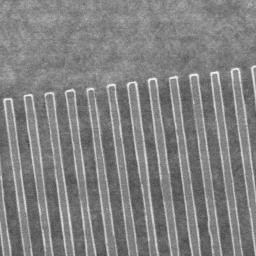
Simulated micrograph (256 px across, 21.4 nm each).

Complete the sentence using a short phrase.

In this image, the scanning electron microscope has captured parallel lines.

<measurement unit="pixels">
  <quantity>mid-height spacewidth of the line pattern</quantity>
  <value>12.6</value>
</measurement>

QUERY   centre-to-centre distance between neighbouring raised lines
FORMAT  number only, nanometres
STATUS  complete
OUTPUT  446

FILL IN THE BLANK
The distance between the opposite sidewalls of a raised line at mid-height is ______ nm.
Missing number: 168